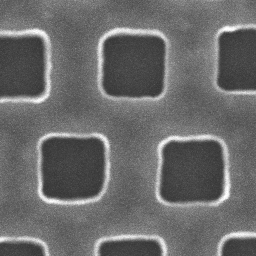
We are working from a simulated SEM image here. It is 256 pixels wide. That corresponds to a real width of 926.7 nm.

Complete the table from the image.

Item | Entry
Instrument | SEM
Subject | holes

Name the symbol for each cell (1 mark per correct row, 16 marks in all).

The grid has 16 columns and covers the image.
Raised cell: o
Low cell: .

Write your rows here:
oooooooooooooooo
oooooooooooooooo
...oooo...oooo..
...ooo....oooo..
...ooo....oooo..
...ooo....oooo..
oooooooooooooooo
oooooooooooooooo
oooooooooooooooo
ooo....ooo....oo
ooo....ooo....oo
ooo...oooo....oo
oooooooooo...ooo
oooooooooooooooo
oooooooooooooooo
...ooo....oooo..